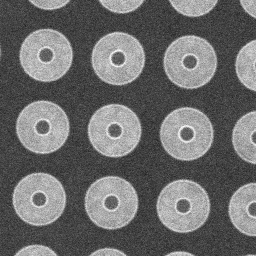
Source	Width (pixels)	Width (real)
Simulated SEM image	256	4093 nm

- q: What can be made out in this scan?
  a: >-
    an array of small figures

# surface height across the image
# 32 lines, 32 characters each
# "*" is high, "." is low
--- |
****....*****....*****.....***..
***********************...*****.
********************************
********************************
****....*****...****************
***......***.....*****....*****.
***..**..***..*...***......***..
***..*...***..**..***..**..***..
***.....****......***..*...***..
****....*****....****.....****..
**********************...******.
********************************
********************************
***....******...****************
***.....****.....****.....*****.
**..**..***...*..***......****..
**...*..***..**...**..**..***...
***.....***......***...*..***..*
****...*****.....****.....***...
**********************...*****..
********************************
********************************
***....******..*****************
**......***.....*****....*****..
**..**..***..*...***......***...
**..**..***..**..***..**..***..*
**......***......***..**..***..*
***....*****....****......***...
*********************...******..
********************************
********************************
***...******...*****************